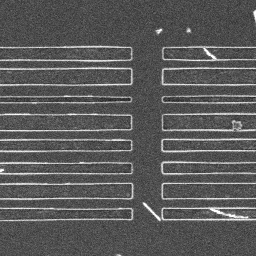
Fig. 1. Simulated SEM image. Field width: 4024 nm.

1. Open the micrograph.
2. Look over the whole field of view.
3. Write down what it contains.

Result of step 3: groups of lines, slits or small figures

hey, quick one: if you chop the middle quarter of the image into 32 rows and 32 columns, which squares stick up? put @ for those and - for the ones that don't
@@@@@@@@@@@@@@@@@@@@@@@@@@@@@@@@
-----------------@@@@@@@@-------
-----------------@@@@@@@@-------
-----------------@@@@@@@@-------
-----------------@@@@@@@@-------
@@@@@@@@@@@@@@@@@@@@@@@@@@@@@@@@
@@@@@@@@@@@@@@@@@@@@@@@@@@@@@@@@
@@@@@@@@@@@@@@@@@@@@@@@@@@@@@@@@
----------------@@@@@@@@@-------
----------------@@@@@@@@@-------
@@@@@@@@@@@@@@@@@@@@@@@@@@@@@@@@
@@@@@@@@@@@@@@@@@@@@@@@@@@@@@@@@
@@@@@@@@@@@@@@@@@@@@@@@@@@@@@@@@
-----------------@@@@@@@@-------
-----------------@@@@@@@@-------
-----------------@@@@@@@@-------
-----------@@@@@@@@@@@@@@-------
@@@@@@@@@@@@@@@@@@@@@@@@@@@@@@@@
@@@@@@@@@@@@@@@@@@@@@@@@@@@@@@@@
-----------------@@@@@@@@-------
-----------------@@@@@@@@-------
----------------@@@@@@@@@-------
@@@@@@@@@@@@@@@@@@@@@@@@@@@@@@@@
@@@@@@@@@@@@@@@@@@@@@@@@@@@@@@@@
@@@@@@@@@@@@@@@@@@@@@@@@@-------
-----------------@@@@@@@@-------
-----------------@@@@@@@@-------
@@@@@@@---------@@@@@@@@@-------
@@@@@@@@@@@@@@@@@@@@@@@@@@@@@@@@
@@@@@@@@@@@@@@@@@@@@@@@@@@@@@@@@
-----------------@@@@@@@@-------
-----------------@@@@@@@@-------